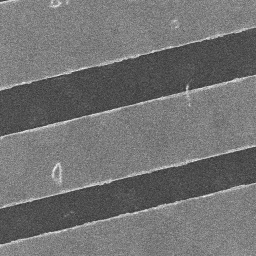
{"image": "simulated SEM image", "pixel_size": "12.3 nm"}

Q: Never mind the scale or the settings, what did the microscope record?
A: one or a few lines or trenches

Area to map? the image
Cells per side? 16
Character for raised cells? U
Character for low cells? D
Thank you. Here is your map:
UUUUUUUUUUUUUUUU
UUUUUUUUUUUUUUUU
UUUUUUUUUUUUUDDD
UUUUUUUUUDDDDDDD
UUUUUDDDDDDDDDDD
UDDDDDDDDDDDDUUU
DDDDDDDDUUUUUUUU
DDDDUUUUUUUUUUUU
UUUUUUUUUUUUUUUU
UUUUUUUUUUUUUUDD
UUUUUUUUUUDDDDDD
UUUUUUDDDDDDDDDD
UUDDDDDDDDDDUUUU
DDDDDDDUUUUUUUUU
DDDUUUUUUUUUUUUU
UUUUUUUUUUUUUUUU